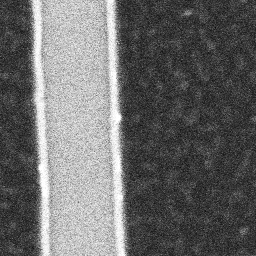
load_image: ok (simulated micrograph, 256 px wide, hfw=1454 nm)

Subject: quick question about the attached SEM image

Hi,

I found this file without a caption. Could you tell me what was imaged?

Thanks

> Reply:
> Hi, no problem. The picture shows one or a few lines or trenches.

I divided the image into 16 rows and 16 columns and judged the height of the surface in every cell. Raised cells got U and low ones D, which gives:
UUDDDDDUUUUUUUUU
UUDDDDDUUUUUUUUU
UUDDDDDUUUUUUUUU
UUDDDDDUUUUUUUUU
UUDDDDDUUUUUUUUU
UUUDDDDUUUUUUUUU
UUUDDDDUUUUUUUUU
UUUDDDDUUUUUUUUU
UUUDDDDUUUUUUUUU
UUUDDDDUUUUUUUUU
UUUDDDDUUUUUUUUU
UUUDDDDUUUUUUUUU
UUUDDDDUUUUUUUUU
UUUDDDDUUUUUUUUU
UUUDDDDUUUUUUUUU
UUUDDDDDUUUUUUUU